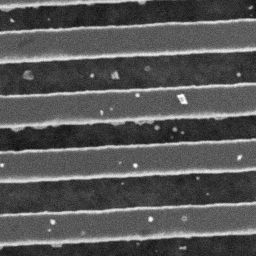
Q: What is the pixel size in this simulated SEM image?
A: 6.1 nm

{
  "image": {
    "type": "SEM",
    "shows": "lines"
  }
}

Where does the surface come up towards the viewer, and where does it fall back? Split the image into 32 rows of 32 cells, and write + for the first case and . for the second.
+++++++++.......................
................................
.............................+++
........++++++++++++++++++++++++
++++++++++++++++++++++++++++++++
++++++++++++++++++++++++++++++++
+++++++++++++++++++++++++++++...
++++++..........................
................................
................................
..............................++
..........++++++++++++++++++++++
++++++++++++++++++++++++++++++++
++++++++++++++++++++++++++++++++
++++++++++++++++++++++++++++++..
+++++++++.......................
................................
.............................+++
..........++++++++++++++++++++++
++++++++++++++++++++++++++++++++
++++++++++++++++++++++++++++++++
++++++++++++++++++++++++++++....
++++++++........................
................................
................................
..............................++
.....+.+++++++++++++++++++++++++
++++++++++++++++++++++++++++++++
++++++++++++++++++++++++++++++++
++++++++++++++++++++++++++......
++++............................
................................